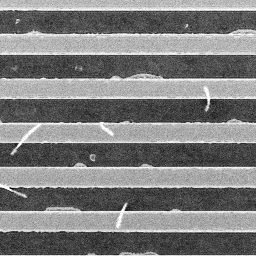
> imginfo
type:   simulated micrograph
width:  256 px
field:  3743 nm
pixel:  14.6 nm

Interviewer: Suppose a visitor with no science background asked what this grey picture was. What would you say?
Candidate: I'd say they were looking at lines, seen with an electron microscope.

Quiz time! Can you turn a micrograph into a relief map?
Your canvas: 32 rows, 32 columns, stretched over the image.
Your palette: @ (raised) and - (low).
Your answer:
@@@@@@@@@@@@@@@@@@@@@@@@@@@@@@@@
--------------------------------
--------------------------------
--------------------------------
@@@@@@@@@@@@@@@@@@@@@@@@@@@@@@@@
@@@@@@@@@@@@@@@@@@@@@@@@@@@@@@@@
@@@@@@@@@@@@@@@@@@@@@@@@@@@@@@@@
--------------------------------
--------------------------------
--------------------------------
@@@@@@@@@@@@@@@@@@@@@@@@@@@@@@@@
@@@@@@@@@@@@@@@@@@@@@@@@@@@@@@@@
--------------------------------
--------------------------------
--------------------------------
@@@@@@@@@@@@@@@@@@@@@@@@@@@@@@@@
@@@@@@@@@@@@@@@@@@@@@@@@@@@@@@@@
@@@@@@@@@@@@@@@@@@@@@@@@@@@@@@@@
--------------------------------
--------------------------------
--------------------------------
@@@@@@@@@@@@@@@@@@@@@@@@@@@@@@@@
@@@@@@@@@@@@@@@@@@@@@@@@@@@@@@@@
--------------------------------
--------------------------------
--------------------------------
@@@@@@@@@@@@@@@@@@@@@@@@@@@@@@@@
@@@@@@@@@@@@@@@@@@@@@@@@@@@@@@@@
@@@@@@@@@@@@@@@@@@@@@@@@@@@@@@@@
--------------------------------
--------------------------------
--------------------------------